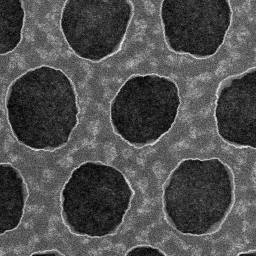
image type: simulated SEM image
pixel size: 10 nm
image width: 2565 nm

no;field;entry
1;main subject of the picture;holes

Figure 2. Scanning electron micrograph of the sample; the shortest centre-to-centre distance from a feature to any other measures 1020 nanometres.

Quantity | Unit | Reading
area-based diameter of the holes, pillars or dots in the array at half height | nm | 721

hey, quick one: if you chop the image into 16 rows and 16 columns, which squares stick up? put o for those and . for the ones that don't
.ooo....oo....oo
.ooo....oo....oo
.ooo....oo....oo
ooooo..ooooooooo
oo..oooooooooooo
o....ooo...ooo..
.....oo....ooo..
o....oo....ooo..
o...oooo..oooo..
oooooooooooooooo
.oooo..oooo...oo
.ooo....oo.....o
.ooo....oo....oo
.ooo....oo....oo
ooooo..oooo..ooo
oooooooooooooooo